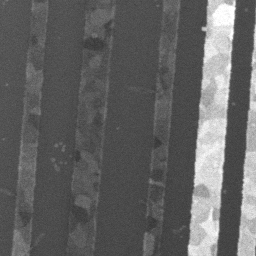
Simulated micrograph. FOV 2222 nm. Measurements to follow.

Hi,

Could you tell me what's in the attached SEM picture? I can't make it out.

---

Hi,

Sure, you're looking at lines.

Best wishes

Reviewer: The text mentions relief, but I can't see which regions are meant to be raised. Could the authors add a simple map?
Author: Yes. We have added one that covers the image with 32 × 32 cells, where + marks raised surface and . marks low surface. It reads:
....++.....+++......++....+++...
....++.....+++......++....+++...
....++.....+++......++....+++...
....++.....+++......++....+++...
....++.....+++......++....+++...
....++....++++......++....+++...
....+.....++++......++....+++...
...++.....++++......++....+++...
...++.....++++......++...++++...
...++.....++++......++...++++...
...++.....+++.......++...++++..+
...++.....+++......+++...+++...+
...++.....+++.......+....+++...+
...++.....+++......++....+++...+
...++.....+++......++....+++...+
...++.....+++......++....+++...+
...++.....+++......++....+++...+
...++.....+++......++....+++...+
...++....++++......++....+++...+
...++....++++......++....+++...+
..++.....++++......++...++++...+
..++.....++++......++...++++...+
..++.....+++.......++...++++...+
..++.....+++.......++...++++..++
..++.....+++.......+....+++...++
..++.....+++......++....+++...++
..++.....+++......++....+++...++
..++.....+++......++....+++...++
..++.....+++......++....+++...++
..++.....+++......++....+++...++
..++....++++......++....+++...++
..++....++++......++....+++...++